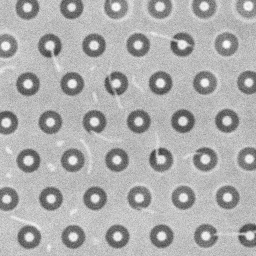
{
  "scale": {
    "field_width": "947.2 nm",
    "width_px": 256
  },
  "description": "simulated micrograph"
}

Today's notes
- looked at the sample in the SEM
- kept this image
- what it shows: an array of small figures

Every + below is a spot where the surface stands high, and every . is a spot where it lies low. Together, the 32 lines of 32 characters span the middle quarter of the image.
++++++++++++++++++++++++++++++++
++++++++++++++++++++++++++++++++
....++++++++...+++++++....++++++
.....+++++......+++++......+++++
.++..+++++..++..+++++..++..+++++
.++..+++++...+..+++++..++..+++++
.....++++++.....++++++.....+++++
....+++++++....++++++++...++++++
++++++++++++++++++++++++++++++++
++++++++++++++++++++++++++++++++
++++++++++++++++++++++++++++++++
+++++++..+++++++++.++++++++++..+
+++++.....++++++.....++++++.....
+++++.....++++++......+++++..+..
+++++..++..++++...++..+++++..++.
+++++.....++++++.....++++++.....
+++++.....++++++.....+++++++....
++++++++++++++++++.++++++++++.++
++++++++++++++++++++++++++++++++
++++++++++++++++++++++++++++++++
++++++++++++++++++++++++++++++++
+...+++++++....+++++++....++++++
.....++++++.....++++++.....+++++
..+..+++++..++..+++++..++..+++++
.++..+++++..++..+++++..++...++++
.....++++++.....+++++......+++++
....+++++++....+++++++....++++++
++++++++++++++++++++++++++++++++
++++++++++++++++++++++++++++++++
++++++++++++++++++++++++++++++++
+++++++++++++++++....+++++++...+
++++++....++++++......+++++.....